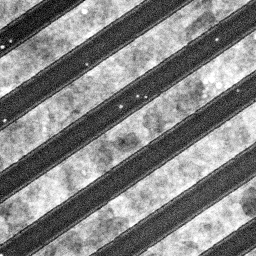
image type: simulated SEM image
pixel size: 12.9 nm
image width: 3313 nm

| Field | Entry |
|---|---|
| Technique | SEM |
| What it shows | lines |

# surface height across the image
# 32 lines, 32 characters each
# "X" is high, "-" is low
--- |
XXXXX-----XXXXXXX-------XXXXXXX-
XXX------XXXXXXX------XXXXXXX---
XX-----XXXXXXX-------XXXXXXX----
------XXXXXXX------XXXXXXX------
----XXXXXXX-------XXXXXXX------X
---XXXXXXX------XXXXXXX-------XX
-XXXXXXXX------XXXXXXX------XXXX
XXXXXXX------XXXXXXX-------XXXXX
XXXXX-------XXXXXXX------XXXXXXX
XXXX------XXXXXXX-------XXXXXXX-
XX-------XXXXXXX------XXXXXXX---
X------XXXXXXXX------XXXXXXX----
------XXXXXXX------XXXXXXX------
----XXXXXXXX------XXXXXXX------X
---XXXXXXX------XXXXXXX------XXX
--XXXXXXX------XXXXXXX------XXXX
XXXXXXX------XXXXXXX-------XXXXX
XXXXXX------XXXXXXX------XXXXXXX
XXXX-------XXXXXXX------XXXXXXX-
XXX------XXXXXXX------XXXXXXX---
XX------XXXXXXX------XXXXXXX----
------XXXXXXX------XXXXXXX------
-----XXXXXXX------XXXXXXX-------
---XXXXXXX-------XXXXXXX------XX
--XXXXXXX------XXXXXXX-------XXX
XXXXXXX------XXXXXXX-------XXXXX
XXXXXX------XXXXXXX------XXXXXXX
XXXX-------XXXXXXX------XXXXXXX-
XXX------XXXXXXX-------XXXXXXX--
XX------XXXXXXX------XXXXXXX----
------XXXXXXX-------XXXXXXX-----
-----XXXXXXX------XXXXXXX------X